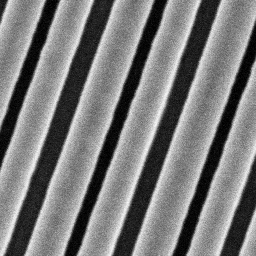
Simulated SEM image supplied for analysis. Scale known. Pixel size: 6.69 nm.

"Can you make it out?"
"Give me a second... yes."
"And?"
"lines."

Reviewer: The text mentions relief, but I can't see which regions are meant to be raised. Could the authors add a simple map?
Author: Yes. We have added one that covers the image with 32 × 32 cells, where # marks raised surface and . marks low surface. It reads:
.####..####...#####..####...####
.####..####...#####..###...#####
#####..####...####..####...#####
####..####...#####..####...#####
####..####...#####..###...#####.
####..####...####..####...#####.
###..####...#####..####..#####..
###..####...####..####...#####..
###..####..#####..####...#####..
##..####...#####..####..#####..#
##..####...####..####...#####..#
#...####..#####..####...#####..#
#..####...#####..####..#####..##
#..####...####..####...#####..##
..####...#####..####...#####.###
..####...#####..####..#####..###
..####...####..####...#####..###
.####...#####..####...####..####
.####...#####..####..#####..####
.####...####..####...#####..####
####...#####..####...####..####.
####...#####.####...#####..####.
####..#####..####...#####..####.
###...#####..####...####..####..
###...####..####...#####..####..
###..#####..####...#####..####..
##...#####..####..#####..####...
##...####..####...#####..####...
#...#####..####...#####..####..#
#...#####..####..#####..####...#
#...####..####...#####..####..##
...#####..####...#####..###...##